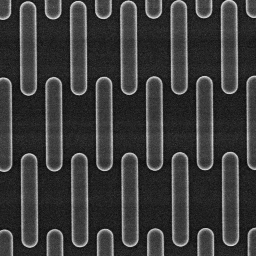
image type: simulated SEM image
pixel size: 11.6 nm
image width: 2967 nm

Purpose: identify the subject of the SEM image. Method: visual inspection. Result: groups of lines, slits or small figures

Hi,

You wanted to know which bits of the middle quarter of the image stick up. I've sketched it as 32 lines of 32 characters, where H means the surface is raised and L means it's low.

LLHHHHLLLLLLLLHHHHLLLLLLLLLHHHHL
LLHHHHLLLLLLLLHHHHLLLLLLLLLHHHHL
LLHHHHLLLLLLLLHHHHLLLLLLLLLHHHHL
LLHHHHLLLHHLLLHHHHLLLHHHLLLHHHHL
LLHHHHLLHHHHLLHHHHLLLHHHLLLHHHHL
LLHHHHLLHHHHLLHHHHLLLHHHLLLHHHHL
LLHHHLLLHHHHLLLHHHLLLHHHLLLHHHHL
LLLHLLLLHHHHLLLLLLLLLHHHLLLLLLLL
LLLLLLLLHHHHLLLLLLLLLHHHLLLLLLLL
LLLLLLLLHHHHLLLLLLLLLHHHHLLLLLLL
LLLLLLLLHHHHLLLLLLLLLHHHHLLLLLLL
LLLLLLLLHHHHLLLLLLLLLHHHHLLLLLLL
LLLLLLLLHHHHLLLLLLLLLHHHHLLLLLLL
LLLLLLLLHHHHLLLLLLLLLHHHHLLLLLLL
LLLLLLLLHHHHLLLLLLLLLHHHHLLLLLLL
LLLLLLLLHHHHLLLLLLLLLHHHHLLLLLLL
LLLLLLLLHHHHLLLLLLLLLHHHHLLLLLLL
LLLLLLLLHHHHLLLLLLLLLHHHHLLLLLLL
LLLLLLLLHHHHLLLLLLLLLHHHHLLLLLLL
LLLLLLLLHHHHLLLLLLLLLHHHHLLLLLLL
LLLLLLLLHHHHLLLLLLLLLHHHHLLLLLLL
LLLLLLLLHHHHLLLLLLLLLHHHHLLLLLLL
LLLHHLLLHHHHLLLLHLLLLHHHHLLLHHLL
LLHHHHLLHHHHLLLHHHLLLHHHHLLHHHHL
LLHHHHLLHHHHLLLHHHLLLHHHHLLHHHHL
LLHHHHLLHHHHLLLHHHLLLHHHLLLHHHHL
LLHHHHLLLHHLLLLHHHLLLLHLLLLHHHHL
LLHHHHLLLLLLLLLHHHLLLLLLLLLHHHHL
LLHHHHLLLLLLLLLHHHLLLLLLLLLHHHHL
LLHHHHLLLLLLLLLHHHLLLLLLLLLHHHHL
LLHHHHLLLLLLLLLHHHLLLLLLLLLHHHHL
LLHHHHLLLLLLLLLHHHLLLLLLLLLHHHHL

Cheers